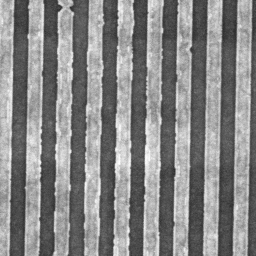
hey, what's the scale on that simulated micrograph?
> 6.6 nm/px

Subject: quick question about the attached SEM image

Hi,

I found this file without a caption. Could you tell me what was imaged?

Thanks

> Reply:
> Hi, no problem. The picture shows parallel lines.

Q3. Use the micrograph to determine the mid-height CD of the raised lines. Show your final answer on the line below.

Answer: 85.8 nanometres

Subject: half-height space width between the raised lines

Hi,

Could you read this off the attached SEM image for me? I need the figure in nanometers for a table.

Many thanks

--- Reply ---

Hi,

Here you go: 111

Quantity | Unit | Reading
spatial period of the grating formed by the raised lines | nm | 196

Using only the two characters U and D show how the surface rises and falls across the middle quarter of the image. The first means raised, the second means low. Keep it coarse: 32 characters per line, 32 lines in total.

UUDDDDUUUUDDDDUUUDDDDUUUDDDDUUUD
UUDDDDUUUUDDDDUUUDDDDUUUDDDDUUUD
UUDDDDUUUDDDDDUUUDDDDUUUDDDDUUUD
UUDDDDUUUDDDDDUUDDDDDUUUDDDDUUUD
UUDDDDUUUDDDDDUUDDDDDUUUDDDDUUUD
UUDDDDUUUDDDDDUUDDDDDUUUDDDDUUUD
UDDDDDUUUDDDDDUUDDDDDUUUDDDDUUUD
UUDDDDUUUDDDDDUUDDDDDUUUDDDDUUUD
UUDDDDUUUDDDDUUUDDDDDUUUDDDDUUUD
UUDDDDUUUDDDDUUUDDDDDUUUDDDDUUUD
UDDDDDUUUDDDDUUUDDDDDUUUDDDDUUUD
UUDDDDUUUDDDDUUUDDDDDUUUDDDDUUUD
UDDDDDUUUDDDDUUUDDDDDUUUDDDDUUUD
UDDDDDUUUDDDDUUUDDDDDUUUDDDDUUUD
UDDDDDUUUDDDDUUUDDDDDUUUDDDDUUUD
UDDDDDUUUDDDDUUUDDDDDUUUDDDDUUUD
UDDDDDUUUDDDDUUUDDDDDUUUDDDDUUUD
UDDDDDUUUDDDDUUUDDDDDUUUDDDDUUUD
UUDDDDUUUDDDDUUUDDDDDUUUDDDDUUUD
UDDDDDUUUDDDDUUUDDDDDUUUDDDDUUUD
UDDDDDUUUDDDDUUUDDDDDUUUDDDDUUUD
UDDDDDUUUDDDDUUUDDDDDUUUDDDDUUUD
UDDDDDUUUDDDDUUUDDDDDUUUDDDDUUUD
UDDDDDUUUDDDDUUUDDDDDUUUDDDDUUUD
UDDDDDUUUDDDDUUUDDDDDUUUDDDDUUUD
UDDDDDUUUDDDDUUUDDDDDUUUDDDDUUUD
UDDDDDUUUDDDDUUUDDDDDUUUDDDDUUUD
UDDDDDUUUDDDDUUUDDDDDUUUDDDDUUUD
UDDDDDUUUDDDDUUUDDDDUUUDDDDDUUUD
UDDDDDUUUDDDDUUUDDDDUUUDDDDDUUUD
UDDDDDUUUDDDDUUUDDDDUUUDDDDDUUUD
UDDDDDUUDDDDDUUUDDDDDUUDDDDDUUUD